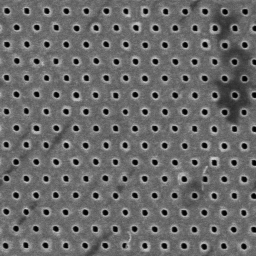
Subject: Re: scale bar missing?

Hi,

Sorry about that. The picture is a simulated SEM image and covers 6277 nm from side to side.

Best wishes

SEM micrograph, a regular array of holes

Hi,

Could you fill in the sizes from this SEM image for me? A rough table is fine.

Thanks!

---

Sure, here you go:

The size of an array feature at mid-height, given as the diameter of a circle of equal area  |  152 nm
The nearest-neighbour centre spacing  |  466 nm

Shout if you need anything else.